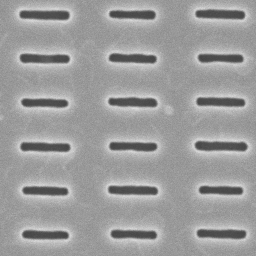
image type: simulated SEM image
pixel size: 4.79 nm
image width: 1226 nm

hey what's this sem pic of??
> a regular array of holes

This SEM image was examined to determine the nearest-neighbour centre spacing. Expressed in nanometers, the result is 210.